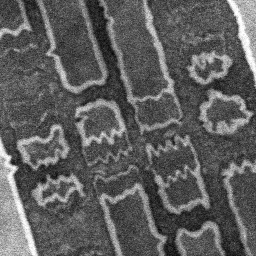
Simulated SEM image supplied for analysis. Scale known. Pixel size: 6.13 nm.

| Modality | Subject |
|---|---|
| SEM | one or a few lines or trenches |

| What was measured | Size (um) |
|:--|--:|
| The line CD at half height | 0.245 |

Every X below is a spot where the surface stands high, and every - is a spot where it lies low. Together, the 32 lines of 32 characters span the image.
XXX--XXXXX---XXXXX-----------XXX
XXX--XXXXXX--XXXXXX-----------XX
XXX---XXXXX---XXXXX-----------XX
XXX---XXXXX---XXXXX-----------XX
------XXXXXX--XXXXX-----------XX
-------XXXXX--XXXXXX-----------X
------XXXXXX---XXXXX-----------X
-------XXXXXX--XXXXX-----XXX---X
-------XXXXXX--XXXXXX---XXXX----
--------XXXXX--XXXXXX---XXX-----
--------XXX-----XXXXX-----------
----------------XXXXX-----------
----------------XX--------XXXX--
-----------XXX-----------XXXXX--
----------XXXXX----------XXXXXX-
----------XXXXX-----------XXXX--
------XX--XXXXX-----------------
----XXXX--X---------------------
---XXXXX------------------------
X--XXXX-------------------------
X---X---------------------------
XX---------------------XX----XXX
X------XX------------XXXX---XXXX
XX---XXXXX-------X--XXXXX----XXX
XX---XXXX------XXX--XXXXXX---XXX
XX---X-------XXXXX---XXX-----XXX
XXX----------XXXXXX----------XXX
XXX-----------XXXXX-----------XX
XXX-----------XXXXX------XX---XX
XXXX----------XXXXXX--XXXXX---XX
XXXX----------XXXXXX--XXXXX----X
XXXX-----------XXXXX---XXXXX---X